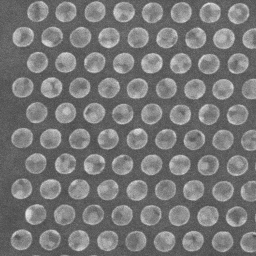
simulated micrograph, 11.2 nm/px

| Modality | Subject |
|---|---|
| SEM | a regular array of raised bodies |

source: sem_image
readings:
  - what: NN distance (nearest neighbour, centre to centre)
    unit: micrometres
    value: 0.317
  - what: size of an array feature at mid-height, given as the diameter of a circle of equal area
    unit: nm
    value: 222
